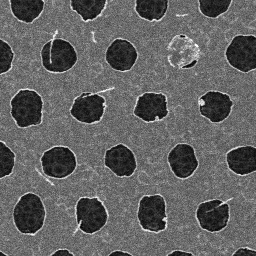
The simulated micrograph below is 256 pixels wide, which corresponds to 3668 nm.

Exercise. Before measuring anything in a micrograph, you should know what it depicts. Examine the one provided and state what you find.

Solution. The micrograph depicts a regular array of holes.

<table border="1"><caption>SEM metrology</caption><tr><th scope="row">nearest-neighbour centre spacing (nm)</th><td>865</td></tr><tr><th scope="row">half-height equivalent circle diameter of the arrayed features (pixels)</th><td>32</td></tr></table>